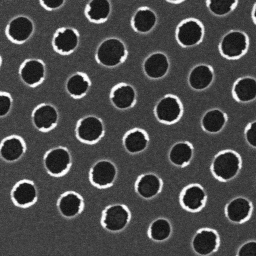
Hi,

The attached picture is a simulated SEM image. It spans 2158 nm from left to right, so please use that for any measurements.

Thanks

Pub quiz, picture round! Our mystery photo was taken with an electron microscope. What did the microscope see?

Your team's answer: a regular array of holes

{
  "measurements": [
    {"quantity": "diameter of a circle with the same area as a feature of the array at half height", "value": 22.8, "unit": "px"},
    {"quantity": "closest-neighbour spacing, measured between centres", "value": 383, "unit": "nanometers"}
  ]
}